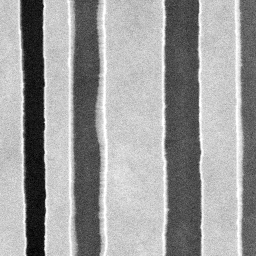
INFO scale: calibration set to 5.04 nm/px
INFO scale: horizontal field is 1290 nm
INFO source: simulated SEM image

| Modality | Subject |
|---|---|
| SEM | lines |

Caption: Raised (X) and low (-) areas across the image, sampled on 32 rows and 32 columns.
XX----XXX----XXXXXXX-----XXXX---
XX----XXX----XXXXXXX-----XXXXX--
XX----XXX----XXXXXXXX----XXXXX--
XXX--XXXX----XXXXXXX-----XXXXX--
XXX---XXX----XXXXXXX-----XXXXX--
XXX---XXX----XXXXXXX-----XXXXX--
XXX---XXX----XXXXXXX-----XXXXX--
XXX---XXX----XXXXXXX-----XXXXX--
XXX---XXX----XXXXXXX-----XXXXX--
XXX---XXX----XXXXXXX-----XXXXX--
XXX---XXX----XXXXXXX-----XXXXX--
XXX---XXX----XXXXXXX-----XXXXX--
XXX---XXX----XXXXXXX-----XXXXX--
XXX---XXX----XXXXXXX-----XXXXX--
XXX---XXX----XXXXXXX-----XXXXX--
XXX---XXX----XXXXXXX-----XXXXX--
XXX---XXX----XXXXXXX-----XXXXX--
XXX---XXX----XXXXXXX-----XXXXX--
XXX---XXX----XXXXXXX-----XXXXX--
XXX---XXX----XXXXXXX-----XXXXX--
XXX---XXX----XXXXXXXX----XXXXX--
XXX---XXX----XXXXXXXX----XXXXX--
XXX---XXX----XXXXXXXX----XXXXX--
XXX---XXX----XXXXXXXX----XXXXX--
XXX---XXX----XXXXXXXX----XXXXX--
XXX---XXX----XXXXXXXX----XXXXX--
XXX---XXX----XXXXXXXX----XXXXX--
XXX---XXX----XXXXXXXX----XXXXX--
XXX---XXX----XXXXXXX-----XXXXX--
XXX---XXX----XXXXXXX-----XXXXX--
XXX---XXX----XXXXXXX-----XXXXX--
XXX---XXX----XXXXXXX-----XXXXX--